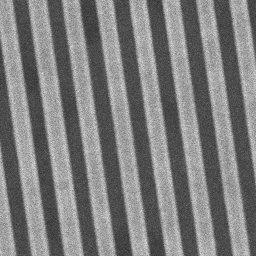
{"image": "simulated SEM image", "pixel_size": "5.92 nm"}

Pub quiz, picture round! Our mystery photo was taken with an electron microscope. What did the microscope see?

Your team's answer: parallel lines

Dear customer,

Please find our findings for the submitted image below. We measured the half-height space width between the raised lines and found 113 nanometers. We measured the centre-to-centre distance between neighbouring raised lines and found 196 nm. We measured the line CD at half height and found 14.2 pixels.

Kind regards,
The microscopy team